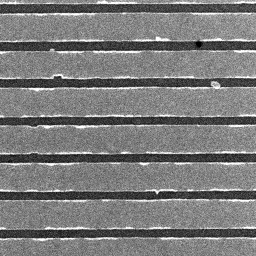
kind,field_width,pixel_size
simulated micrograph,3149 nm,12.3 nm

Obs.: parallel lines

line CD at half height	0.349	um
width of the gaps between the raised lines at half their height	111	nm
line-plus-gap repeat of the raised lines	0.461	microns